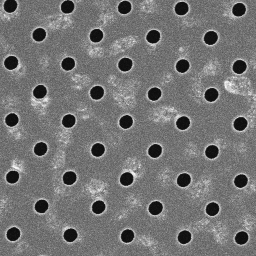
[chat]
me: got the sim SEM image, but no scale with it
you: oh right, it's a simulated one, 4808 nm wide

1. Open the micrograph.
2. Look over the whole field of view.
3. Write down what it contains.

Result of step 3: a regular array of holes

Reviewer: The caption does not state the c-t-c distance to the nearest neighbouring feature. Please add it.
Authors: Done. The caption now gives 39.7 px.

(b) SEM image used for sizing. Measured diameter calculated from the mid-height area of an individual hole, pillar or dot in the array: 260 nm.